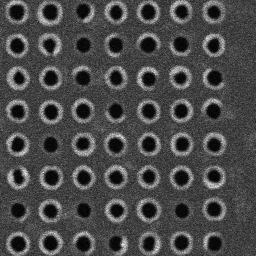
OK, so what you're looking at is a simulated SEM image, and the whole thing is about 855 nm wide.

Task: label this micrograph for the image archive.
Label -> a regular array of holes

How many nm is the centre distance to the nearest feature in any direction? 108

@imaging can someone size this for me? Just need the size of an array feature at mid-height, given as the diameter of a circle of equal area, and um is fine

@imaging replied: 0.0496